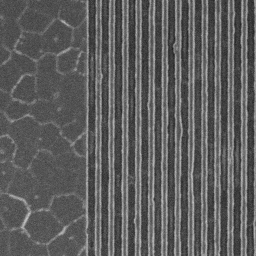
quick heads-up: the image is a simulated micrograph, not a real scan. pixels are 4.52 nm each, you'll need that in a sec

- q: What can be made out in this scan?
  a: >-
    parallel lines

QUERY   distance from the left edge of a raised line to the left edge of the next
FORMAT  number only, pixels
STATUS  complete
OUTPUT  13.2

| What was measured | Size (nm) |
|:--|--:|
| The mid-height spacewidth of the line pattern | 37.8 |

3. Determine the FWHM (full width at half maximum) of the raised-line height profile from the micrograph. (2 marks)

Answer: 0.0248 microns